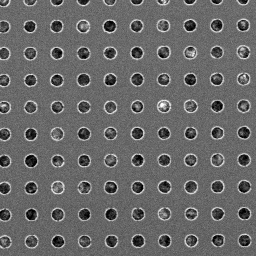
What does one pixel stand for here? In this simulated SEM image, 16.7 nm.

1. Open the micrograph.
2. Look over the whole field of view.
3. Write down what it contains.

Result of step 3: a regular array of holes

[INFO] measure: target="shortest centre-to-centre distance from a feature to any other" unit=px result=26.4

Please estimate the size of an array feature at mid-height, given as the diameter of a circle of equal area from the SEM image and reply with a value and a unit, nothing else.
204 nm